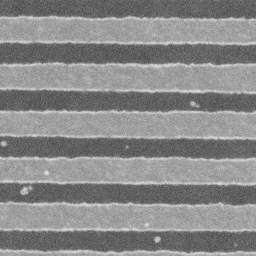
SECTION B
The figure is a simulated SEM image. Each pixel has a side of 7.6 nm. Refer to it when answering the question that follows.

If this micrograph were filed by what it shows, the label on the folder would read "lines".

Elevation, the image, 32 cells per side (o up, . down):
................................
................................
oooooooooooooooooooooooooooooooo
oooooooooooooooooooooooooooooooo
oooooooooooooooooooooooooooooooo
....................o........oo.
................................
................................
oooooooooooooooooooooooooooooooo
oooooooooooooooooooooooooooooooo
oooooooooooooooooooooooooooooooo
............................oooo
................................
................................
oooooooooooooooooooooooooooooooo
oooooooooooooooooooooooooooooooo
oooooooooooooooooooooooooooooooo
................................
................................
................................
oooooooooooooooooooooooooooooooo
oooooooooooooooooooooooooooooooo
oooooooooooooooooooooooooooooooo
................................
................................
oooo.oooo.....o............o....
oooooooooooooooooooooooooooooooo
oooooooooooooooooooooooooooooooo
oooooooooooooooooooooooooooooooo
................................
................................
oooooooooooooo.ooooooo.......oo.